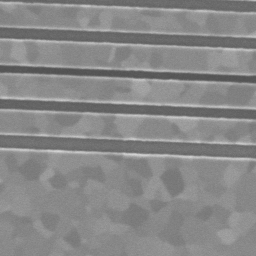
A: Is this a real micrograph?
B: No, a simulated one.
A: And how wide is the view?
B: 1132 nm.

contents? parallel lines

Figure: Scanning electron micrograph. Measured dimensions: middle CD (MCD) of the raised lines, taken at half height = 113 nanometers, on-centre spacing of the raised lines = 158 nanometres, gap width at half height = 10.9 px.